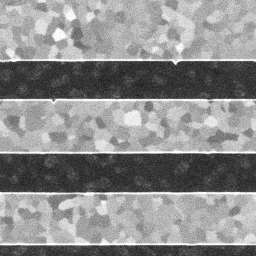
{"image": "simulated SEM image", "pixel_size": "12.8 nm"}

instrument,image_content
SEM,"one or a few lines or trenches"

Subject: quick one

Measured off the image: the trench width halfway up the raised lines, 39.1 pixels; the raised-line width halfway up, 671 nm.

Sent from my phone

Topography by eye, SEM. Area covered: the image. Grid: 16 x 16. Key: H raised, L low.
HHHHHHHHHHHHHHHH
HHHHHHHHHHHHHHHH
HHHHHHHHHHHHHHHH
HHHHHHHHHHHHHHHH
LLLLLLLLLLLLLLLL
LLLLLLLLLLLLLLLL
HHHHHHHHHHHHHHHH
HHHHHHHHHHHHHHHH
HHHHHHHHHHHHHHHH
HHHHHHHHHHHHHHHH
LLLLLLLLLLLLLLLL
LLLLLLLLLLLLLLLL
HHHHHHHHHHHHHHHH
HHHHHHHHHHHHHHHH
HHHHHHHHHHHHHHHH
LLLLLLLLLLLLLLLL